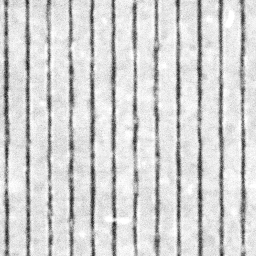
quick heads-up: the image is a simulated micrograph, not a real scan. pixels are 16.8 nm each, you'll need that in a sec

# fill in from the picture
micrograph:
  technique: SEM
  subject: parallel lines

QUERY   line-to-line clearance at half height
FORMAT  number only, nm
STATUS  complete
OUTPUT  86.2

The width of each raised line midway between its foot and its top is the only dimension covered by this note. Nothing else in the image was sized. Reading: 0.271 µm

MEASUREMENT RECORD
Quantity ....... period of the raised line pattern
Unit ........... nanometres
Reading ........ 361